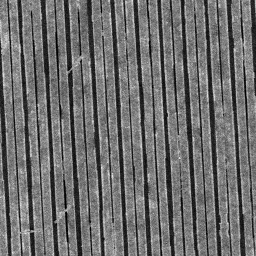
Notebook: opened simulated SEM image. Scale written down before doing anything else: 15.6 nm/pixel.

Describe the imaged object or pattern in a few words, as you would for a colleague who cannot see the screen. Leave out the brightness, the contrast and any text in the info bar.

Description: parallel lines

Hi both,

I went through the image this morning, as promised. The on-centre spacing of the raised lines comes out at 0.181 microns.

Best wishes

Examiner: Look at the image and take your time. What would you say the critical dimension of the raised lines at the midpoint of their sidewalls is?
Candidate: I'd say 125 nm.